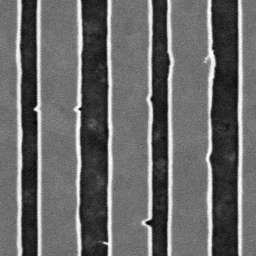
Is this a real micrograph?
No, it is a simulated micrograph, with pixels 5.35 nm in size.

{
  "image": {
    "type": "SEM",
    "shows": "one or a few lines or trenches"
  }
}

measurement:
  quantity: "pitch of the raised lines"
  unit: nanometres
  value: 350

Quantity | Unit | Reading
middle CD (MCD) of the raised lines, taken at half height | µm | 0.215